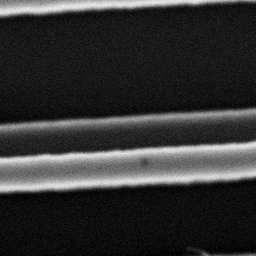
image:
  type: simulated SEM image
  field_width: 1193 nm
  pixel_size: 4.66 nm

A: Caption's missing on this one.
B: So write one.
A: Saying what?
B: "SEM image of lines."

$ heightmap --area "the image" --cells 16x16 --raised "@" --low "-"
@@@@------------
----------------
----------------
----------------
----------------
----------------
----------------
-------@@@@@@@@@
@@@@@@@@@@@@@@@@
@@@@@@@@@@@@@@@@
@@@@@@@@@@@@@@@@
@@@@@@@@--------
----------------
----------------
----------------
----------------